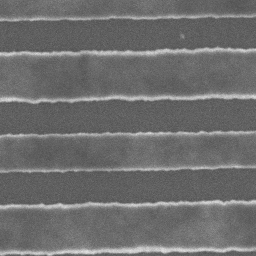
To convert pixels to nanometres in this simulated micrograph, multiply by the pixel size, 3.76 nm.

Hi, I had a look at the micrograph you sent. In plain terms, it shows lines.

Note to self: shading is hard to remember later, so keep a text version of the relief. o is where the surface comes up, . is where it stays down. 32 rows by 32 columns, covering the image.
oooooooooooooooooooooooooooooooo
oooooooooooooooooooooooooooooooo
oooo............................
................................
................................
................................
..oo......ooooooo.oooooooooooooo
oooooooooooooooooooooooooooooooo
oooooooooooooooooooooooooooooooo
oooooooooooooooooooooooooooooooo
oooooooooooooooooooooooooooooooo
oooooooooooooooooooooooooooooooo
oooooooooooo....................
................................
................................
................................
.........................ooooooo
oooooooooooooooooooooooooooooooo
oooooooooooooooooooooooooooooooo
oooooooooooooooooooooooooooooooo
oooooooooooooooooooooooooooooooo
................................
................................
................................
................................
...........oooo...oooooooooooooo
oooooooooooooooooooooooooooooooo
oooooooooooooooooooooooooooooooo
oooooooooooooooooooooooooooooooo
oooooooooooooooooooooooooooooooo
oooooooooooooooooooooooooooooooo
oooooooooooo....................